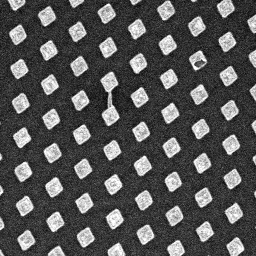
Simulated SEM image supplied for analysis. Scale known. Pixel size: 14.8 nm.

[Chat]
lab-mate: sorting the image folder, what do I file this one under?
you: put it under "a regular array of raised bodies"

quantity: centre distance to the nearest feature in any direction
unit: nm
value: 506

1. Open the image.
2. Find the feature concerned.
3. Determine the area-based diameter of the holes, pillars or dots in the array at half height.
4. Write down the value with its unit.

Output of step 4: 239 nm